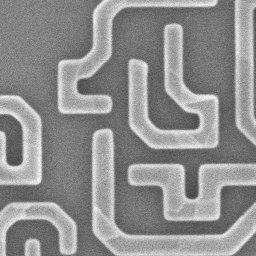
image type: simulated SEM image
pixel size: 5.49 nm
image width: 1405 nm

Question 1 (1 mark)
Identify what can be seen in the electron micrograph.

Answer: wiring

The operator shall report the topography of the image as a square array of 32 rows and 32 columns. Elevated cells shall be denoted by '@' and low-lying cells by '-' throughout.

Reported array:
------------@@@@@@@@@@@@@@@--@@@
------------@@@--------------@@@
------------@@---------------@@@
------------@@-------@@------@@@
------------@@-------@@------@@@
------------@@-------@@------@@@
-----------@@@-------@@-------@@
---------@@@@--------@@-------@@
-------@@@@@----@@---@@------@@@
-------@@@@-----@@---@@------@@@
-------@@@------@@---@@------@@@
-------@@@------@@---@@@-----@@@
@@@----@@@@@@@--@@----@@@@@---@@
@@@@---@@@@@@@--@@-----@@@@---@@
--@@@-----------@@-------@@---@@
---@@-----------@@@------@@---@@
---@@-------@@---@@@@@@@@@@---@@
@--@@-------@@----@@@@@@@@@----@
@--@@-------@@-----@@@@---------
@--@@-------@@------------------
@--@@-------@@------------------
@@@@@-------@@--@@@@@@@--@@@@@@@
@@@@@-------@@--@@@@@@@--@@@@@@@
------------@@------@@@--@@@----
------------@@-------@@--@@-----
-@@@@@@-----@@-------@@@@@@-----
@@@@@@@@----@@-------@@@@@@----@
@@----@@@---@@-------@@-------@@
@------@@---@@@--------------@@@
@------@@---@@@@@--------@@@@@@-
@--@@--@@----@@@@@@@@@@@@@@@@@--
@--@@---@-----@@@@@@@@@@@@@@@---